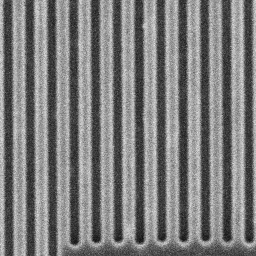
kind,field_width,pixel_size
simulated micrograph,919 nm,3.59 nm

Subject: parallel lines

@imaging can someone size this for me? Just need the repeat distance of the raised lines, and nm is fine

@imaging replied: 78.4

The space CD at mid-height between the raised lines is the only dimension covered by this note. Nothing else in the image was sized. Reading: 39.9 nanometres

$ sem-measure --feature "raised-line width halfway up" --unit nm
39.9